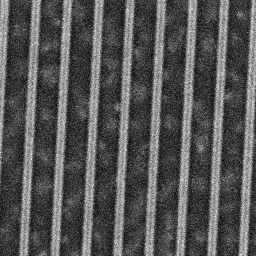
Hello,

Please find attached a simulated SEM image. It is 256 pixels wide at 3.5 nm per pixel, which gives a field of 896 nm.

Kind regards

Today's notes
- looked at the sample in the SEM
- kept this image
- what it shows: parallel lines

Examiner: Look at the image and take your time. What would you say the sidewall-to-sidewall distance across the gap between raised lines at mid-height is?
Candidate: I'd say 87.9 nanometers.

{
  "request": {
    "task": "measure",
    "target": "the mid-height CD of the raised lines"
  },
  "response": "20.6 nanometers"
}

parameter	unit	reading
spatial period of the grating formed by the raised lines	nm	110